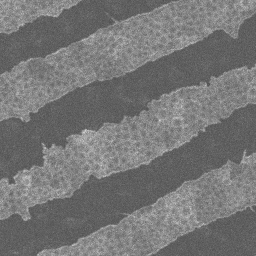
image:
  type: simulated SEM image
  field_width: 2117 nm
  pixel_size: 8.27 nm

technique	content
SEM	one or a few lines or trenches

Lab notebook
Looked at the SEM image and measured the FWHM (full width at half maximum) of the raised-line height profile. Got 360 nm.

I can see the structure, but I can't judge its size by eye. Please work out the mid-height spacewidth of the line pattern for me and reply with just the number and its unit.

345 nanometres